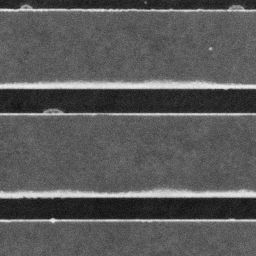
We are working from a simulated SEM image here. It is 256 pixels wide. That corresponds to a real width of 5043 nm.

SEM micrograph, lines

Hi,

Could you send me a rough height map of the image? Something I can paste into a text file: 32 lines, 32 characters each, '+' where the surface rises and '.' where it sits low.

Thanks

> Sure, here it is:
................................
++++++++++++++++++++++++++++++++
++++++++++++++++++++++++++++++++
++++++++++++++++++++++++++++++++
++++++++++++++++++++++++++++++++
++++++++++++++++++++++++++++++++
++++++++++++++++++++++++++++++++
++++++++++++++++++++++++++++++++
++++++++++++++++++++++++++++++++
++++++++++++++++++++++++++++++++
++++++++++++++++++++++++++++++++
................................
................................
................................
++++++++++++++++++++++++++++++++
++++++++++++++++++++++++++++++++
++++++++++++++++++++++++++++++++
++++++++++++++++++++++++++++++++
++++++++++++++++++++++++++++++++
++++++++++++++++++++++++++++++++
++++++++++++++++++++++++++++++++
++++++++++++++++++++++++++++++++
++++++++++++++++++++++++++++++++
++++++++++++++++++++++++++++++++
++++++++++++++++++++..++++++++++
................................
................................
......+.........................
++++++++++++++++++++++++++++++++
++++++++++++++++++++++++++++++++
++++++++++++++++++++++++++++++++
++++++++++++++++++++++++++++++++